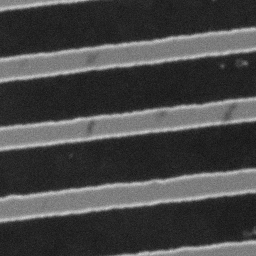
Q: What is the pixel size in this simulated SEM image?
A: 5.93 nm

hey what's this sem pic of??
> lines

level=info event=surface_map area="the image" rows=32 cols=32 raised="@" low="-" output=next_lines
@@@@@@--------------------------
--------------------------------
--------------------------------
--------------------------------
------------------------@@@@@@@@
---------------@@@@@@@@@@@@@@@@@
-------@@@@@@@@@@@@@@@@@@@@@@@--
@@@@@@@@@@@@@@@@@@@@@@----------
@@@@@@@@@@@@@@------------------
@@@@@@--------------------------
--------------------------------
--------------------------------
-----------------------------@@@
---------------------@@@@@@@@@@@
------------@@@@@@@@@@@@@@@@@@@@
----@@@@@@@@@@@@@@@@@@@@@@@@----
@@@@@@@@@@@@@@@@@@@-------------
@@@@@@@@@@@---------------------
@@------------------------------
--------------------------------
--------------------------------
-----------------------------@@@
--------------------@@@@@@@@@@@@
----------@@@@@@@@@@@@@@@@@@@@@@
-@@@@@@@@@@@@@@@@@@@@@@@@@@-----
@@@@@@@@@@@@@@@@@@@-------------
@@@@@@@@@@@---------------------
@@------------------------------
--------------------------------
--------------------------------
----------------------------@@@@
-------------------@@@@@@@@@@@@@